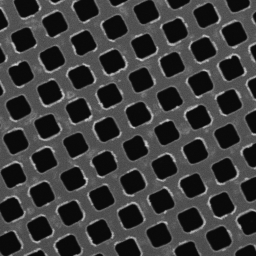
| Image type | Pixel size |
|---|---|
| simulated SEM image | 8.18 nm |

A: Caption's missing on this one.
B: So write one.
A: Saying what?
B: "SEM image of a regular array of holes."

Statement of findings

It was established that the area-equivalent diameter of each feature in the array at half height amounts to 0.19 µm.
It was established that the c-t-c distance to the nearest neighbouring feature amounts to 0.279 µm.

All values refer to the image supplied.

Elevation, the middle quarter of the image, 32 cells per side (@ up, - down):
@@@@-@@@@@-----@@@@@@@@@------@@
@@----@@@@----@@@@@--@@@@-----@@
@------@@@@@@@@@@----@@@@---@@@@
@------@@@@@@@@@------@@@@@@@@@-
@@-----@@@@@@@@@@-----@@@@@@@@@-
@@---@@@@@---@@@@-----@@@@@@@@@@
@@@@@@@@------@@@@--@@@@@---@@@@
@@@@@@@@------@@@@@@@@@------@@@
@@@@@@@@@------@@@@@@@@------@@@
@@----@@@-----@@@@@@@@@@------@@
@-----@@@@--@@@@@---@@@@-----@@@
@------@@@@@@@@@-----@@@@--@@@@@
@------@@@@@@@@@-----@@@@@@@@@--
@@----@@@@--@@@@------@@@@@@@@@-
@@--@@@@-----@@@-----@@@@--@@@@-
@@@@@@@@-----@@@@--@@@@-----@@@@
@@@@@@@@------@@@@@@@@@-----@@@@
@@@-@@@@------@@@@@@@@@------@@@
-----@@@@----@@@@--@@@@------@@@
------@@@@-@@@@-----@@@@---@@@@@
------@@@@@@@@@-----@@@@@@@@@@--
@-----@@@@@@@@@------@@@@@@@@@--
@---@@@@@---@@@------@@@@@@@@@--
@@@@@@@------@@@---@@@@@---@@@@-
@@@@@@@------@@@@@@@@@-----@@@@-
@@@@@@@@-----@@@@@@@@@------@@@@
@---@@@@-----@@@@@@@@@------@@@@
-----@@@@--@@@@----@@@@-----@@@@
-----@@@@@@@@@------@@@@--@@@@--
------@@@@@@@@------@@@@@@@@@---
-----@@@@--@@@@-----@@@@@@@@@---
@-@@@@@----@@@@-----@@@@--@@@@--